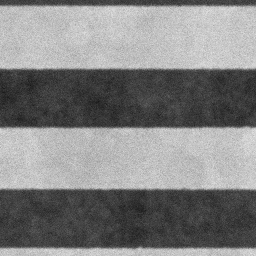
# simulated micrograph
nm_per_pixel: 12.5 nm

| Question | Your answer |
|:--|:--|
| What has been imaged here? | one or a few lines or trenches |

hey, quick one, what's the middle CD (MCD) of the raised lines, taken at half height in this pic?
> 767 nanometres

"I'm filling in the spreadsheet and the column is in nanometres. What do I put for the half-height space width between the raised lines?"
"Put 749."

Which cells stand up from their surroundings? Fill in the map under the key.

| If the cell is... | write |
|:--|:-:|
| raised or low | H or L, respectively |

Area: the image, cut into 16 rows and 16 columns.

HHHHHHHHHHHHHHHH
HHHHHHHHHHHHHHHH
HHHHHHHHHHHHHHHH
HHHHHHHHHHHHHHHH
LLLLLLLLLLLLLLLL
LLLLLLLLLLLLLLLL
LLLLLLLLLLLLLLLL
LLLLLLLLLLLLLLLL
HHHHHHHHHHHHHHHH
HHHHHHHHHHHHHHHH
HHHHHHHHHHHHHHHH
HHHHHHHHHHHHHHHH
LLLLLLLLLLLLLLLL
LLLLLLLLLLLLLLLL
LLLLLLLLLLLLLLLL
LLLLLLLLLLLLLLLL